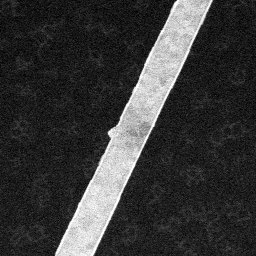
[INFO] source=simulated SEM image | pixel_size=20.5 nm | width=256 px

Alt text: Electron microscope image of one or a few lines or trenches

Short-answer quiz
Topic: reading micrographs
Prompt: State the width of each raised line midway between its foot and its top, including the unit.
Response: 0.654 um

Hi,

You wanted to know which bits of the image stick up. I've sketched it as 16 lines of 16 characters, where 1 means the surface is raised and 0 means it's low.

0000000000011000
0000000000111000
0000000000110000
0000000001110000
0000000001100000
0000000001100000
0000000011000000
0000000011000000
0000000110000000
0000000110000000
0000001100000000
0000001100000000
0000011000000000
0000011000000000
0000110000000000
0000110000000000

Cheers